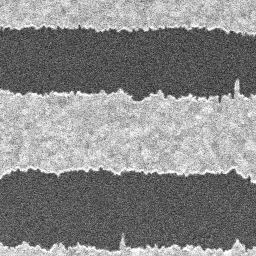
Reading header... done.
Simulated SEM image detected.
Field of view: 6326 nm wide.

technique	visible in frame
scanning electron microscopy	one or a few lines or trenches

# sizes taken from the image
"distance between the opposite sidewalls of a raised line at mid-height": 1.86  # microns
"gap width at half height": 1800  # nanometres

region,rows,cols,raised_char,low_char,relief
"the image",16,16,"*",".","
****************
****************
................
................
................
................
****************
****************
****************
****************
****************
................
................
................
................
**.***.*..**..*.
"